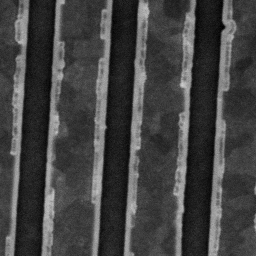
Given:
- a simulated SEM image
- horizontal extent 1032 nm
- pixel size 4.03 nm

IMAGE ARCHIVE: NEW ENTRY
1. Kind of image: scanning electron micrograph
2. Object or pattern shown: one or a few lines or trenches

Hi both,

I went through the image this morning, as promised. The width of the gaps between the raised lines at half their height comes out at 125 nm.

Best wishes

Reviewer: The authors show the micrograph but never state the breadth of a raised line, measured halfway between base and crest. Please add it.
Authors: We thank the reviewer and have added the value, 210 nanometers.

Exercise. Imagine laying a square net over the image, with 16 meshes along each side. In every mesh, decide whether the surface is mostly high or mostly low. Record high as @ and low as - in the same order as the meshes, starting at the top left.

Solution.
@@--@@@--@@@--@@
@@--@@@--@@@--@@
@@--@@@--@@@--@@
@--@@@@--@@@--@@
@--@@@@--@@@--@@
@--@@@@--@@@--@@
@--@@@---@@@--@@
@--@@@--@@@@--@@
@--@@@--@@@@--@@
@--@@@--@@@@--@@
@--@@@--@@@---@@
@--@@@--@@@--@@@
@--@@@--@@@--@@@
@--@@@--@@@--@@@
@--@@@--@@@--@@@
@--@@@--@@@--@@@